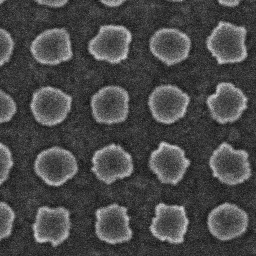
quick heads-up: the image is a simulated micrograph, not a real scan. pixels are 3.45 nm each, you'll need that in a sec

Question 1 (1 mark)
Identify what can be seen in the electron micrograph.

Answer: a regular array of raised bodies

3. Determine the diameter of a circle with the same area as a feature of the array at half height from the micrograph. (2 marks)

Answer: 126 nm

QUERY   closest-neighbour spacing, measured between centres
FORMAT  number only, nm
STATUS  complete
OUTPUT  199